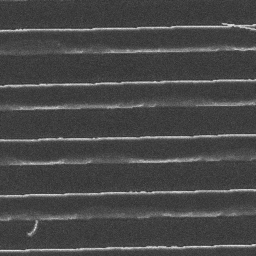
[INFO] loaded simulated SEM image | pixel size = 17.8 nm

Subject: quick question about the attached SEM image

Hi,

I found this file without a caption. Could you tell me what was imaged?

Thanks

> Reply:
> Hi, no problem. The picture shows lines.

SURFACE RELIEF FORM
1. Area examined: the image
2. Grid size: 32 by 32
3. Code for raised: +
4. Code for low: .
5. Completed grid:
................................
................................
................................
.................+++++++++++++++
++++++++++++++++++++++++++++++++
++++++++++++++++++++++++++++++++
................................
................................
................................
................................
............++++++++++++++++++++
++++++++++++++++++++++++++++++++
++++++++++++++++++++++++++++++++
..+++++.........................
................................
................................
................................
....++++++++++++++++++++++++++++
++++++++++++++++++++++++++++++++
++++++++++++++++++++++++++++++++
................................
................................
................................
................................
++++++++++++++++++++++++++++++++
++++++++++++++++++++++++++++++++
+++++++++++++++++++++++++++++...
................................
................................
................................
................................
++++++++++++++++++++++++++++++++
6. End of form